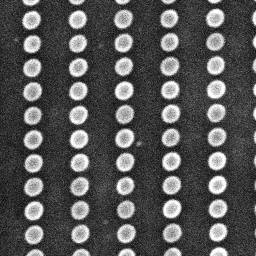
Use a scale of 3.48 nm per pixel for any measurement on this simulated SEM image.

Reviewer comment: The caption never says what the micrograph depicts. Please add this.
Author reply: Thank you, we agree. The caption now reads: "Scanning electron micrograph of a regular array of raised bodies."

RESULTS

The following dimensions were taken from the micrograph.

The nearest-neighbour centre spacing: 82.4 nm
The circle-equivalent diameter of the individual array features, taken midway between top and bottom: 16.4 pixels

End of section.